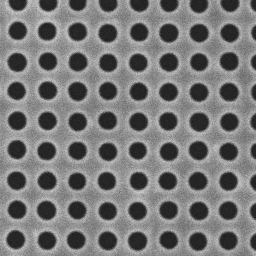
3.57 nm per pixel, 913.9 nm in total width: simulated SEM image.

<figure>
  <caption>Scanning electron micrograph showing a regular array of holes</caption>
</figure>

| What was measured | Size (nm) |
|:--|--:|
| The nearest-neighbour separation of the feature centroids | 105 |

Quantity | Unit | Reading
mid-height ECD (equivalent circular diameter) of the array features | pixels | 18.6